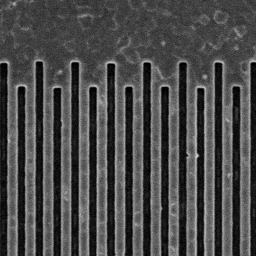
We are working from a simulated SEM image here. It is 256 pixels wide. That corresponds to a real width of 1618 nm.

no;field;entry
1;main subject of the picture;parallel lines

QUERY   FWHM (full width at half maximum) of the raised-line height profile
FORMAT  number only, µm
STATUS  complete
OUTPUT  0.0624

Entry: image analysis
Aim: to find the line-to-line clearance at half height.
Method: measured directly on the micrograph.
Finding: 0.0506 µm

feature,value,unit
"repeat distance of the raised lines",0.114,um